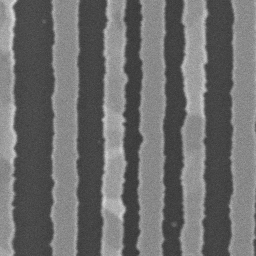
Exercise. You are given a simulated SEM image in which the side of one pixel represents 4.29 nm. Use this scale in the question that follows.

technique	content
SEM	lines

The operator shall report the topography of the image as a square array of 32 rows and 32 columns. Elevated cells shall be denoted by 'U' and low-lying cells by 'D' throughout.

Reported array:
UUDDDDDUUUDDDDUUDDUUUDDUUUDDDUUU
UUDDDDDUUUDDDUUDDDUUUDDUUUDDDUUU
UUDDDDDUUUDDDDUDDDUUUDDUUUDDDUUU
UUDDDDDUUUDDDUUUDDUUUDDUUDDDDUUU
UUDDDDDUUUDDDUUUDDUUUDDUUDDDDUUU
UDDDDDDUUUDDDUUUDDUUDDDUUDDDDUUU
UDDDDDDUUUDDDUUDDDUUDDDUUUDDDUUU
UUDDDDDUUUDDDUUDDDUUUDDUUUDDDUUU
UUDDDDDUUUDDDUUDDDUUUDDUUDDDDUUU
UUDDDDDUUUDDDUUUDDUUUDDUUDDDDUUU
UUDDDDDUUUDDDUUUDDUUUDDUUDDDDUUU
UUDDDDDUUUDDDUUDDDUUUDDUUDDDDUUU
UUDDDDDUUUDDDUUUDDUUUDDDUDDDDUUU
UUDDDDDUUDDDDUUDDDUUUDDUUDDDDUUU
UUDDDDDUUUDDDUUDDDUUUDDUUDDDDUUU
UUDDDDDUUUDDDUUDDDUUDDDUUDDDDUUU
UUDDDDDUUUDDDUUDDDUUDDDUUDDDDUUU
UUDDDDDUUUDDDUUDDDUUDDDUUDDDDUUU
UUDDDDDUUUDDDUUDDDUUDDDUUDDDDUUU
UUDDDDDUUUDDDUUDDUUUUDDUUDDDDUUU
UUDDDDDUUDDDDUUUDUUUDDDUUDDDDUUU
UUDDDDDUUUDDDUUDDUUUDDDUUDDDDUUU
UUDDDDDUUUDDDUUDDUUUDDDUUDDDDUUU
UDDDDDDUUUDDDUUDDUUUUDDUUDDDDUUU
UUDDDDDUUUDDDUUDDUUUDDDUUDDDDUUU
UDDDDDDUUUDDDUUDDUUUDDDUUDDDDUUU
UDDDDDUUUUDDDUUDDUUUDDDUUDDDDUUU
UUDDDDDUUUDDDUUDDDUUDDDUUDDDDUUU
UUDDDDDUUUDDDUUDDDUUDDDUUDDDDUUU
UDDDDDDUUUDDDUUDDUUUDDDUUDDDDUUU
UDDDDDUUUDDDDUUDDUUUDDDUUDDDDUUU
UUDDDDDUUDDDDUUDDUUUDDDUUDDDDUUU